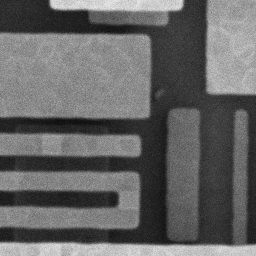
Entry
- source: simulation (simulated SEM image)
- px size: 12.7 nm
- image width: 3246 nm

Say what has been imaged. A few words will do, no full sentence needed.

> wiring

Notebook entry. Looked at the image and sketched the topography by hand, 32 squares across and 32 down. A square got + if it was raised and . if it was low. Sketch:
......+++++++++++++++++.........
................................
................................
................................
++++++++++++++++++..............
+++++++++++++++++++.............
+++++++++++++++++++.............
+++++++++++++++++++.............
+++++++++++++++++++.............
+++++++++++++++++++.............
+++++++++++++++++++.............
+++++++++++++++++++.............
+++++++++++++++++++.............
+++++++++++++++++++.............
++.+++++++++++++++..............
................................
................................
++++++++++++++++++..............
++++++++++++++++++..............
..........+....++...............
................................
................................
+++++++++++++++++...............
+++++++++++++++++...............
...............++...............
...............++...............
+++++++++++++++++...............
+++++++++++++++++...............
.....+++....+++++...............
................................
+++++++++++.++..................
++++++++++++++++++++++++++++++++